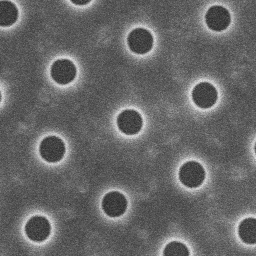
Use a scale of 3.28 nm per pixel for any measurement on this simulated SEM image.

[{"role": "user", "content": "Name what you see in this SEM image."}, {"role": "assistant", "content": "a regular array of holes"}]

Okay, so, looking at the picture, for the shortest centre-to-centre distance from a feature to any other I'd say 261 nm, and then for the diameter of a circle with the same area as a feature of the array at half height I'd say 0.0874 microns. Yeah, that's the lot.